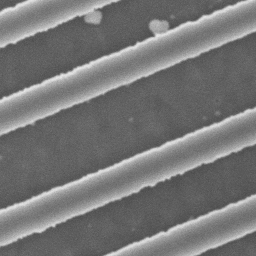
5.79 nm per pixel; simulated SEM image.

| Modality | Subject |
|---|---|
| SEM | lines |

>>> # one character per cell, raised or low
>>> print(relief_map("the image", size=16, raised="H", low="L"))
LHHHHHLLLLLLLLHH
HHHHLLLLLLLHHHHH
HLLLLLLLLHHHHHHL
LLLLLLLHHHHHLLLL
LLLLHHHHHHLLLLLL
LLHHHHHLLLLLLLLL
HHHHHLLLLLLLLLLL
HHLLLLLLLLLLLLHH
LLLLLLLLLLLLHHHH
LLLLLLLLLHHHHHHL
LLLLLLLHHHHHLLLL
LLLLHHHHHHLLLLLL
LLHHHHHLLLLLLLLH
HHHHHLLLLLLLLHHH
HHLLLLLLLLHHHHHH
LLLLLLLLHHHHHLLL